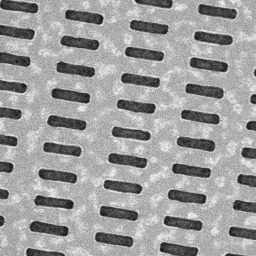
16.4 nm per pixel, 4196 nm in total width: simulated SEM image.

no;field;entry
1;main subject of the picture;a regular array of holes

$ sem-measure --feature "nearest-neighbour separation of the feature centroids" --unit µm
0.436